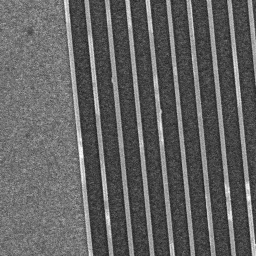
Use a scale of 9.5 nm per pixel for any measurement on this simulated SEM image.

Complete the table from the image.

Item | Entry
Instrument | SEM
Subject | parallel lines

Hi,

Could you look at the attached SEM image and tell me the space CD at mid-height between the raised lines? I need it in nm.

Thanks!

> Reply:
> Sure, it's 149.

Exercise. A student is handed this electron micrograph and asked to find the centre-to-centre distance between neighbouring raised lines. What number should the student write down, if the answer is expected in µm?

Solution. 0.193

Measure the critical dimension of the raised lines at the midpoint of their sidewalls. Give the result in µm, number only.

0.0437